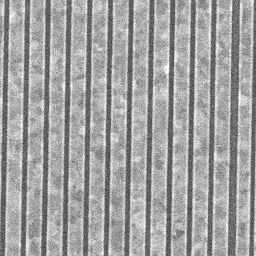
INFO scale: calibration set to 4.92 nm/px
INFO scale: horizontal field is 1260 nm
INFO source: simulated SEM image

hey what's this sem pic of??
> parallel lines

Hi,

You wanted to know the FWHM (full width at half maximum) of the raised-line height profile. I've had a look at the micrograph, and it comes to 14.2 pixels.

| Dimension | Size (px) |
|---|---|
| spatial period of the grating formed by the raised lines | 20.9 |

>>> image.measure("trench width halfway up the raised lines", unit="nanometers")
32.6